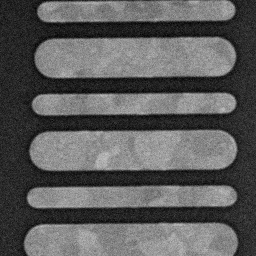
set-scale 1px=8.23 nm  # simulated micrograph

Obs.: groups of lines, slits or small figures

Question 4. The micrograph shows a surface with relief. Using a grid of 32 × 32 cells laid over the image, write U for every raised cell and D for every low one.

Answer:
DDDDDUUUUUUUUUUUUUUUUUUUUUUUUDDD
DDDDDUUUUUUUUUUUUUUUUUUUUUUUUDDD
DDDDDUUUUUUUUUUUUUUUUUUUUDDDDDDD
DDDDDDDDDDDDDDDDDDDDDDDDDDDDDDDD
DDDDDDDDDDDDDDDDDDDDDDDDDDDDDDDD
DDDDDUUUUUUUUUUUUUUUUUUUUUUUUDDD
DDDDDUUUUUUUUUUUUUUUUUUUUUUUUDDD
DDDDUUUUUUUUUUUUUUUUUUUUUUUUUDDD
DDDDDUUUUUUUUUUUUUUUUUUUUUUUUDDD
DDDDDDUUUUUUUUUUUUUUUUUDDDDDDDDD
DDDDDDDDDDDDDDDDDDDDDDDDDDDDDDDD
DDDDDDDDDDDDDDDDDDDDDDDDDDDDDDDD
DDDDUUUUUUUUUUUUUUUUUUUUUUUUUDDD
DDDDUUUUUUUUUUUUUUUUUUUUUUUUUDDD
DDDDDDDDDDDDDDDDDDDDDDDDDDDDDDDD
DDDDDDDDDDDDDDDDDDDDDDDDDDDDDDDD
DDDDDDDDDDDDDDDDDUUUUUUUUUUUDDDD
DDDDUUUUUUUUUUUUUUUUUUUUUUUUUDDD
DDDDUUUUUUUUUUUUUUUUUUUUUUUUUDDD
DDDDUUUUUUUUUUUUUUUUUUUUUUUUUDDD
DDDDUUUUUUUUUUUUUUUUUUUUUUUUUDDD
DDDDDDDDDDDDDDDDDDDDDDDDDDDDDDDD
DDDDDDDDDDDDDDDDDDDDDDDDDDDDDDDD
DDDDDDDUUUUUUUUUUUUUUUUUUUUUUDDD
DDDUUUUUUUUUUUUUUUUUUUUUUUUUUDDD
DDDDUUUUUUUUUUUUUUUUUUUUUUUUUDDD
DDDDDDDDDDDDDDDDDDDDDDDDDDDDDDDD
DDDDDDDDDDDDDDDDDDDDDDDDDDDDDDDD
DDDDUUUUUUUUUUUUUUUUUUUUUUUUUDDD
DDDUUUUUUUUUUUUUUUUUUUUUUUUUUDDD
DDDUUUUUUUUUUUUUUUUUUUUUUUUUUUDD
DDDUUUUUUUUUUUUUUUUUUUUUUUUUUDDD